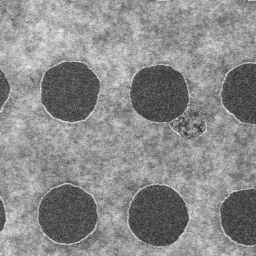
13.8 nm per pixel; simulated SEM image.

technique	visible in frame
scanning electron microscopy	raised bodies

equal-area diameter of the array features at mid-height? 855 nanometres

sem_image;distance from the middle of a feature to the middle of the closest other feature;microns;1.29